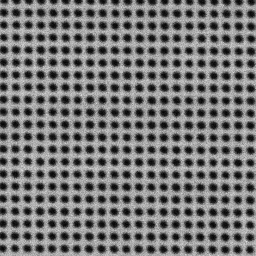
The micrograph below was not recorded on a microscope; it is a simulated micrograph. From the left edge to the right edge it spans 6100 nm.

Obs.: a regular array of holes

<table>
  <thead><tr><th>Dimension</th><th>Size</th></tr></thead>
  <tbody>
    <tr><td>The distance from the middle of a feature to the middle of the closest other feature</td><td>290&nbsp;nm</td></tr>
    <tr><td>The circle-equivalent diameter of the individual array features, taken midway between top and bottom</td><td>198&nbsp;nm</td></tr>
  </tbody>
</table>